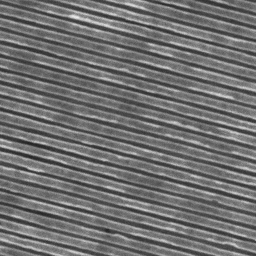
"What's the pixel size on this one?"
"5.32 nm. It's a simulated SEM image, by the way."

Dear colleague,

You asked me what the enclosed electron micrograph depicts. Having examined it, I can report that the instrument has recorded parallel lines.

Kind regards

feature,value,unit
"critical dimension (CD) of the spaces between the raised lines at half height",25.7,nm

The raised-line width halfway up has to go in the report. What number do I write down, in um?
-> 0.0425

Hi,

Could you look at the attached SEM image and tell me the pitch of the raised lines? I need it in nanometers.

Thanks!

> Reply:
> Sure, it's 68.9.